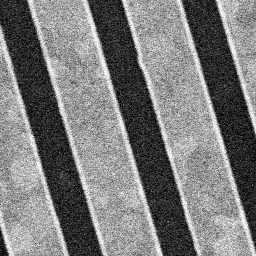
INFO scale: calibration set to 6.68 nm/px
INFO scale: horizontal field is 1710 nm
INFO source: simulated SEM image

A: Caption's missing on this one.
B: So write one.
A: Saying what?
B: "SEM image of one or a few lines or trenches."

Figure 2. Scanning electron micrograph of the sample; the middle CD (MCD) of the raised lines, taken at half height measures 354 nanometers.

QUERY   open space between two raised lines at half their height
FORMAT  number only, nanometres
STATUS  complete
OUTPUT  254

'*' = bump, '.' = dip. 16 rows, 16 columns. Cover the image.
..***...***...**
..****..****..**
...***..****..**
...***...***...*
*..****..****..*
*...***..****..*
*...***...***...
**..***...***...
**..****..****..
**...***...***..
***..***...***..
***..****..****.
***...***..****.
***...***...***.
****..****..***.
.***..****..****